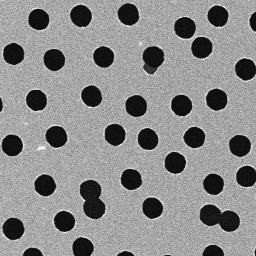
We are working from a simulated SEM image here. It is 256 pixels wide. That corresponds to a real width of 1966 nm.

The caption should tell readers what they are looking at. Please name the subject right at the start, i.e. a regular array of holes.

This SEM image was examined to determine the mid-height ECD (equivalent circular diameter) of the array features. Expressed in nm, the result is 164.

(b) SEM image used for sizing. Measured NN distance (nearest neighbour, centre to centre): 313 nm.